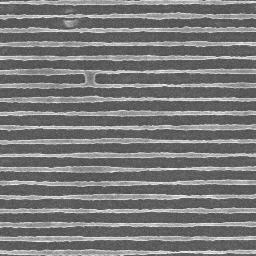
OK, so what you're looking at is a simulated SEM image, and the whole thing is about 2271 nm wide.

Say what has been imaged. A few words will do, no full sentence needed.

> parallel lines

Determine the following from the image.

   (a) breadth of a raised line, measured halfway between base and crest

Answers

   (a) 0.0388 micrometres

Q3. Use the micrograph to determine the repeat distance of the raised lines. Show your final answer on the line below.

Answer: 123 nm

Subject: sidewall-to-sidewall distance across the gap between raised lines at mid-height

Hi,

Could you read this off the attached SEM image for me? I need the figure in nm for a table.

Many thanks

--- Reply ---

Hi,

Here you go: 86.5